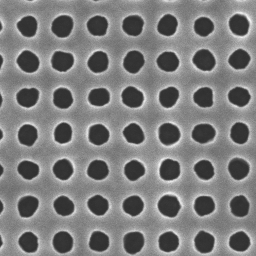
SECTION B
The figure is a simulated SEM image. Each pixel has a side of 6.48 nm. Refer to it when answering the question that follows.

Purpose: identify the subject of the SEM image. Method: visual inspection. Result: a regular array of holes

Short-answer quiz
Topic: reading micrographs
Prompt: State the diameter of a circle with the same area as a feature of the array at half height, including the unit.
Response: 0.135 microns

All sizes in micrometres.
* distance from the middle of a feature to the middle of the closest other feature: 0.223